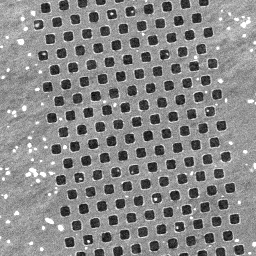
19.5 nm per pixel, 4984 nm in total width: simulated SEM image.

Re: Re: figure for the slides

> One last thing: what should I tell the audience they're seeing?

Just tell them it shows a regular array of raised bodies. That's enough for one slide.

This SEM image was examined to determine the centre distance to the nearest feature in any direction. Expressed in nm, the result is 352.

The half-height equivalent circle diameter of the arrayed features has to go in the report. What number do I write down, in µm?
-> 0.226